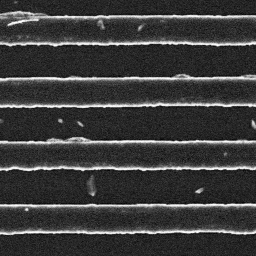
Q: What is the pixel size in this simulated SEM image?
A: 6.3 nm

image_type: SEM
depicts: lines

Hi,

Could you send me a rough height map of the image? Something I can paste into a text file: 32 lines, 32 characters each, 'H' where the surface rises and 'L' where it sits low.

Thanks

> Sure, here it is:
LLLLLLLLLLLLLLLLLLLLLLLLLLLLLLLL
LLLLLLLLLLLLLLLLLLLLLLLLLLLLLLLL
HHHHHHHHHHHHHHHHHHHHHHHHHHHHHHHH
HHHHHHHHHHHHHHHHHHHHHHHHHHHHHHHH
HHHHHHHHHHHHHHHHHHHHHHHHHHHHHHHH
LHLLLLHHLLLLHHLLLLLLLLLLLLHHHHLL
LLLLLLLLLLLLLLLLLLLLLLLLLLLLLLLL
LLLLLLLLLLLLLLLLLLLLLLLLLLLLLLLL
LLLLLLLLLLLLLLLLLLLLLLLLLLLLLLLL
LLLLLLLLLLLLLLLLLLLLLLLLLLLLLLLL
HHHHHHHHHHHHHHHHHHHHHHHHHHHHHHHH
HHHHHHHHHHHHHHHHHHHHHHHHHHHHHHHH
HHHHHHHHHHHHHHHHHHHHHHHHHHHHHHHH
LLLLLLLLLLLLLLLLLLLLLLLLLLLLLLLL
LLLLLLLLLLLLLLLLLLLLLLLLLLLLLLLL
LLLLLLLLLLLLLLLLLLLLLLLLLLLLLLLL
LLLLLLLLLLLLLLLLLLLLLLLLLLLLLLLL
LLLLLLLLLLLLLLLLLLLLLLLLLLLLLLLL
HHHHHHHHHHHHHHHHHHHHHHHHHHHHHHHH
HHHHHHHHHHHHHHHHHHHHHHHHHHHHHHHH
HHHHHHHHHHHHHHHHHHHHHHHHHHHHHHHH
LLLLLLLLLLLLLLLLLLLLLLLLLLLLLLLL
LLLLLLLLLLLLLLLLLLLLLLLLLLLLLLLL
LLLLLLLLLLLLLLLLLLLLLLLLLLLLLLLL
LLLLLLLLLLLLLLLLLLLLLLLLLLLLLLLL
LLLLLLLLLLLLLLLLLLLLLLLLLLLLLLLL
HHHHHHHHHHHHHHHHHHHHHHHHHHHHHHHH
HHHHHHHHHHHHHHHHHHHHHHHHHHHHHHHH
HHHHHHHHHHHHHHHHHHHHHHHHHHHHHHHH
LLLLLLLLLLLLLLLLLLLLLLLLLLLLLLLL
LLLLLLLLLLLLLLLLLLLLLLLLLLLLLLLL
LLLLLLLLLLLLLLLLLLLLLLLLLLLLLLLL